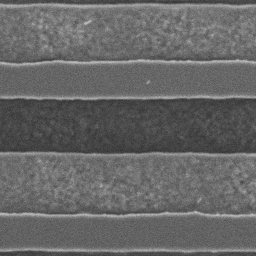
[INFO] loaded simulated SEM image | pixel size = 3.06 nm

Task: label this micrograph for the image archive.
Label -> lines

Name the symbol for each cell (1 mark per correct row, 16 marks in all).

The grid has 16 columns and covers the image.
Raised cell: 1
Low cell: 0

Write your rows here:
1111111111111111
1111111111111111
1111111111111111
1111111111111111
1111111111111111
1111111111111111
0000000000000000
0000000000000000
0000000000000000
0000000000000000
1111111111111111
1111111111111111
1111111111111111
1111111111111111
1111111111111111
1111111111111111